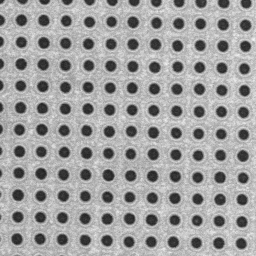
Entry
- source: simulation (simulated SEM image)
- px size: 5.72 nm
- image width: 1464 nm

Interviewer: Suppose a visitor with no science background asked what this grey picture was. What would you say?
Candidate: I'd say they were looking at a regular array of holes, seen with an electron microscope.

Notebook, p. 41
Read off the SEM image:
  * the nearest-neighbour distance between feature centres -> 124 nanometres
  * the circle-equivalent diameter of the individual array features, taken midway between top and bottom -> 0.0716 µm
